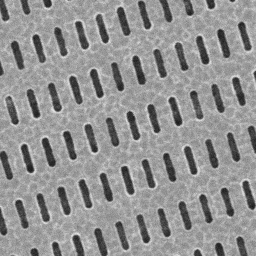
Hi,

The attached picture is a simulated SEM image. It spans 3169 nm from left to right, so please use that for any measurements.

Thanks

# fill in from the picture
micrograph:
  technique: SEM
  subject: a regular array of holes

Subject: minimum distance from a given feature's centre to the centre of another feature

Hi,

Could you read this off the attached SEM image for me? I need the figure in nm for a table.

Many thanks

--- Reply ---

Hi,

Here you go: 274